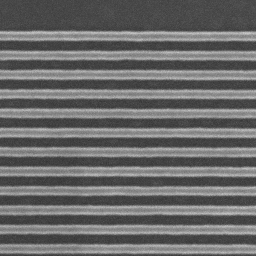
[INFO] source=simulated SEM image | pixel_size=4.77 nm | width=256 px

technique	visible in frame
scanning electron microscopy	parallel lines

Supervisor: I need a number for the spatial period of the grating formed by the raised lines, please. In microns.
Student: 0.0921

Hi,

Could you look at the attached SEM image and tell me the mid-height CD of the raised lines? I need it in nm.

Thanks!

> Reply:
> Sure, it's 38.1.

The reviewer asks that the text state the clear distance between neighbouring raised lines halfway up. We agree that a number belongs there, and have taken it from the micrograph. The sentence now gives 0.0554 micrometres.